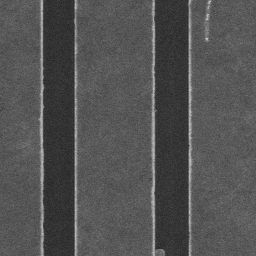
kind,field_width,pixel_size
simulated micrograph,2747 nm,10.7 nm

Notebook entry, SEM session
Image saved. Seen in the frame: lines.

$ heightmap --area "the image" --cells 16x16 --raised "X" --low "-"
XXX--XXXXX--XXXX
XXX--XXXXX--XXXX
XXX--XXXXX--XXXX
XXX--XXXXX--XXXX
XXX--XXXXX--XXXX
XXX--XXXXX--XXXX
XXX--XXXXX--XXXX
XXX--XXXXX--XXXX
XXX--XXXXX--XXXX
XXX--XXXXX--XXXX
XXX--XXXXX--XXXX
XXX--XXXXX--XXXX
XXX--XXXXX--XXXX
XXX--XXXXX--XXXX
XXX--XXXXX--XXXX
XXX--XXXXX--XXXX